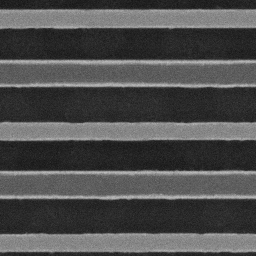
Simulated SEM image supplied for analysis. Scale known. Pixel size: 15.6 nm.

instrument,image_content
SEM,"lines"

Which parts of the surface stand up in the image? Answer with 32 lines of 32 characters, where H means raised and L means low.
LLLLLLLLLLLLLLLLLLLLLLLLLLLLLLLL
HHHHHHHHHHHHHHHHHHHHHHHHHHHHHHHH
HHHHHHHHHHHHHHHHHHHHHHHHHHHHHHHH
HHHHLLLLHLLLLLLLLLLLLLLLLLLLLLLL
LLLLLLLLLLLLLLLLLLLLLLLLLLLLLLLL
LLLLLLLLLLLLLLLLLLLLLLLLLLLLLLLL
LLLLLLLLLLLLLLLLLLLLLLLLLLLLLLLL
LLLLLLLLLLLLLLLLLLLLLLLLLLLLLLLL
HHHHHHHHHHHHHHHHHHHHHHHHHHHHHHHH
HHHHHHHHHHHHHHHHHHHHHHHHHHHHHHHH
HHHHHHHHHHHHHHHHHHHHHHHHHHHHHHHH
LLLLLLLLLLLLLLLLLLLLLLLLLLLLLLLL
LLLLLLLLLLLLLLLLLLLLLLLLLLLLLLLL
LLLLLLLLLLLLLLLLLLLLLLLLLLLLLLLL
LLLLLLLLLLLLLLLLLLLLLLLLLLLLLLLL
HHHHHHHHHHHHHHHHHHHHHHHHHHHHHHHH
HHHHHHHHHHHHHHHHHHHHHHHHHHHHHHHH
HHHHHHHLLLLLLLHHHHHLLLLLLLLLLLHL
LLLLLLLLLLLLLLLLLLLLLLLLLLLLLLLL
LLLLLLLLLLLLLLLLLLLLLLLLLLLLLLLL
LLLLLLLLLLLLLLLLLLLLLLLLLLLLLLLL
HHHHHHHHHHHHHHHHHHHHHHHHHHHHHHHH
HHHHHHHHHHHHHHHHHHHHHHHHHHHHHHHH
HHHHHHHHHHHHHHHHHHHHHHHHHHHHHHHH
HHHHHHHHHHHHHHHHHHHHHHHHHHHHHHHH
LLLLLLLLLLLLLLLLLLLLLLLLLLLLLLLL
LLLLLLLLLLLLLLLLLLLLLLLLLLLLLLLL
LLLLLLLLLLLLLLLLLLLLLLLLLLLLLLLL
LLLLLLLLLLLLLLLLLLLLLLLLLLLLLLLL
HHHHHHHHHHHHHHHHHHHHHHHHHHHHHHHH
HHHHHHHHHHHHHHHHHHHHHHHHHHHHHHHH
LLLLLLLLLLLLLHLLHHLLLLLLLLLLLHLL